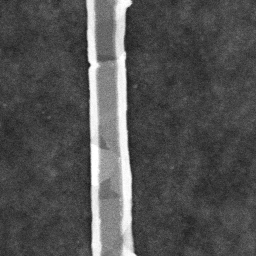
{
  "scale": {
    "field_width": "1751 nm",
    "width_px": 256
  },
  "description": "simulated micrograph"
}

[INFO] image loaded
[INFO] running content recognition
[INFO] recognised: one or a few lines or trenches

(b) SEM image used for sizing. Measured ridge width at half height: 206 nanometres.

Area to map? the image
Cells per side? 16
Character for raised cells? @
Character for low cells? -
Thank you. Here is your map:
------@@--------
------@@--------
------@@--------
------@@--------
------@@--------
------@@--------
------@@--------
------@@--------
------@@--------
------@@--------
------@@--------
------@@--------
------@@--------
------@@--------
------@@--------
------@@--------